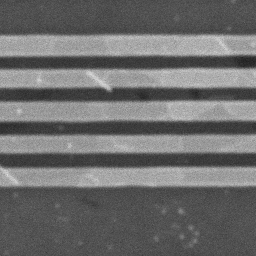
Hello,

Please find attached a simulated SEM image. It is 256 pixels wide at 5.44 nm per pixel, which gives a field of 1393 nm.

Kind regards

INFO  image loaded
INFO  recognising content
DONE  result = wiring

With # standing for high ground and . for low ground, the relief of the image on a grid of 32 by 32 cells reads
................................
................................
................................
................................
................................
################################
################################
................................
................................
################################
################################
................................
................................
################################
################################
................................
................................
################################
################################
................................
................................
################################
################################
................................
................................
................................
................................
................................
................................
................................
................................
................................